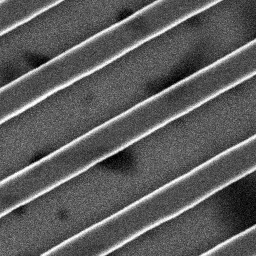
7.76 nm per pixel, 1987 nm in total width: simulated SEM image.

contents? lines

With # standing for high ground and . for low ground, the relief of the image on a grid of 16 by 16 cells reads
###......####...
#......####.....
.....####.......
....###.......##
..####......####
####.......###..
##.......####...
.......####.....
.....####.......
...####.......##
..####......####
####.......###..
##.......####...
.......####.....
.....####......#
...####......###